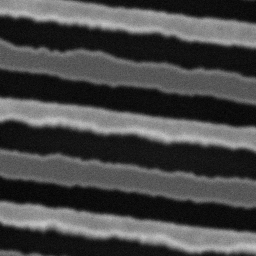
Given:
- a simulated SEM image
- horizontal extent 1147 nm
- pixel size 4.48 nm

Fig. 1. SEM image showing lines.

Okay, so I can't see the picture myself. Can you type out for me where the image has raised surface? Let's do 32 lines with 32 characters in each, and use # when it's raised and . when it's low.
###########.....................
####################............
....#######################.....
.............###################
......................##########
#..........................#####
#######.#####...................
###############.................
######################..........
.......#######################..
.............###################
.....................###########
###..........................###
############....................
##################..............
...########################.....
............####################
....................############
.............................###
#####.##........................
##############..................
####################............
....###########################.
.............###################
....................############
##..........................####
###########.....................
##################..............
....##.##################.......
...........#####################
.....................###########
##......................#..###.#